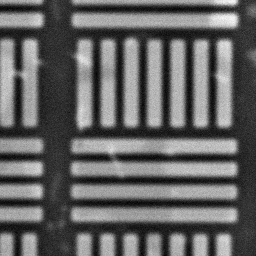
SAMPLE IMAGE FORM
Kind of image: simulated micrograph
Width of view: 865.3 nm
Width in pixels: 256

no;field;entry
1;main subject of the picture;groups of lines, slits or small figures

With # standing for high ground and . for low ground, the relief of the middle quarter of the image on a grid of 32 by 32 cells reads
....###...##...###...###...###..
....###...##...###...###...###..
....###...##...###...###...###..
....###...##...###...###...###..
....###...##...###...###...###..
....###...##...###...###...###..
....###...##...###...###...###..
....###...##...###...###...###..
....###...##...###...###...###..
....###...##...###...###...###..
....###...##...###...###...###..
....###...##...###...###...###..
...####...##...###...###...###..
...####...##...###...###...###..
....###...##...###...###...###..
....#.....##....##...###...###..
................................
................................
................................
..##############################
..##############################
..##############################
..........................#.....
................................
................................
..##############################
..##############################
..##############################
................................
................................
..##############################
..##############################